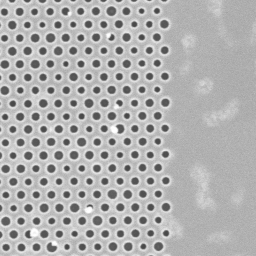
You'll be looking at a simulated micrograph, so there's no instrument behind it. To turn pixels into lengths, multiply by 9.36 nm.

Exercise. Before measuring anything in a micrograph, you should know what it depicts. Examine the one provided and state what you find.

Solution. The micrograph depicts a regular array of holes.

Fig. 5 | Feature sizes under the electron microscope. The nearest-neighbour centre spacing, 139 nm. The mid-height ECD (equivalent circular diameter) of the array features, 75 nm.